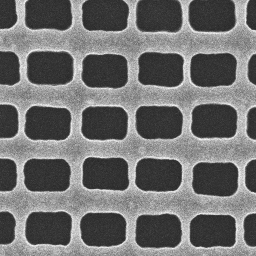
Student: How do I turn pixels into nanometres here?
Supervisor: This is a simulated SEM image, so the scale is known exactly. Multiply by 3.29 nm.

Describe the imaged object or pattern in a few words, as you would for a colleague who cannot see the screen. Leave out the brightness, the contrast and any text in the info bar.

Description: a regular array of holes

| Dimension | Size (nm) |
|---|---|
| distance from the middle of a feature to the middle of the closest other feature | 171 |